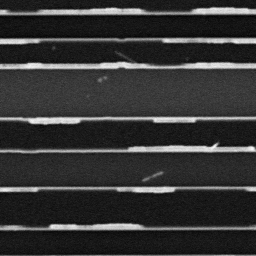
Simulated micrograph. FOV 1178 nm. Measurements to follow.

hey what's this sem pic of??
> one or a few lines or trenches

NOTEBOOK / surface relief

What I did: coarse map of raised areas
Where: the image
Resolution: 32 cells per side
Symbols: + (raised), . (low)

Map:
++++++++++++++++++++++++++++++++
++++++++++++++++++++++++++++++++
................................
................................
................................
++++++++++++++++++++++++++++++++
++++++++++++++++++++++++++++++++
++++++++++++++++++++++++++++++++
++++++++++++....................
................................
................................
................................
................................
................................
................................
++++++++++++++++++++++++++++++++
++++++++++++++++++++++++++++++++
++++++++++++++++++++++++++++++++
++++++++++++++++++++++++++++++++
................................
................................
................................
................................
....................++....++++++
++++++++++++++++++++++++++++++++
++++++++++++++++++++++++++++++++
++++++++++++++++++++++++++++++++
++++++++++++++++++++++++++++++++
++++++++++++++++++++++++++++++++
................................
................................
................................